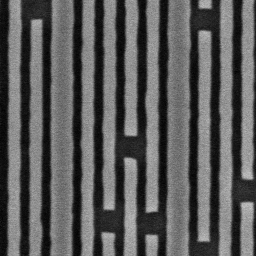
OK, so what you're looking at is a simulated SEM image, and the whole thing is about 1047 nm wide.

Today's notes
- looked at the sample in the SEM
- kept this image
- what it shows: groups of lines, slits or small figures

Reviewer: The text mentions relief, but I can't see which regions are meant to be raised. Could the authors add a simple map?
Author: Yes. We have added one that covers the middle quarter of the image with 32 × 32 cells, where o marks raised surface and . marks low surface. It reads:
oo...oo...ooo..ooo...oo...ooooo.
oo...oo...ooo..ooo...oo...ooooo.
oo..ooo...ooo..ooo...oo...ooooo.
oo..ooo...ooo...oo...oo...ooooo.
oo...oo...ooo..ooo...oo...ooooo.
oo...oo...ooo..ooo...oo...ooooo.
oo...oo...ooo..ooo...oo...ooooo.
oo...oo...ooo..ooo..ooo...ooooo.
oo...oo...ooo..ooo..ooo...ooooo.
oo...oo...ooo..ooo..ooo...ooooo.
oo...oo...ooo..ooo..ooo...ooooo.
oo..ooo...ooo..ooo..ooo...ooooo.
oo..ooo...ooo..ooo...oo...ooooo.
oo..ooo...ooo..ooo...oo...ooooo.
oo...oo...ooo..ooo...oo...ooooo.
oo...oo...ooo..ooo...oo...ooooo.
oo...oo...ooo..ooo...oo...ooooo.
oo...oo...ooo..ooo...oo...ooooo.
oo..ooo...ooo........oo...ooooo.
oo..ooo...ooo........oo...ooooo.
oo..ooo...ooo........oo...ooooo.
oo..ooo...ooo........oo...ooooo.
oo...oo...ooo........oo...ooooo.
oo...oo...ooo........oo...ooooo.
oo..ooo...ooo..ooo...oo...ooooo.
oo...oo...ooo..ooo...oo...ooooo.
oo...oo...ooo..ooo...oo...ooooo.
oo...oo...ooo..ooo...oo...ooooo.
oo...oo...ooo..ooo...oo...ooooo.
oo..ooo...ooo..ooo...oo...ooooo.
oo..ooo...ooo..ooo...oo...ooooo.
oo..ooo...ooo..ooo...oo...ooooo.